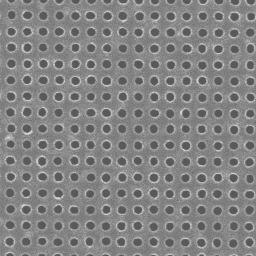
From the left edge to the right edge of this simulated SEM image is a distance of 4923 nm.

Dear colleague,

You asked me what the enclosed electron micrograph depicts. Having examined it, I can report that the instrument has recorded a regular array of holes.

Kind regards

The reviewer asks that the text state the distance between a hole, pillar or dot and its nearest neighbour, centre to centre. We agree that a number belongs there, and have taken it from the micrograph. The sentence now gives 301 nm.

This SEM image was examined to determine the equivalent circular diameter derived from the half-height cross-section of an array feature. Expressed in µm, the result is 0.162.